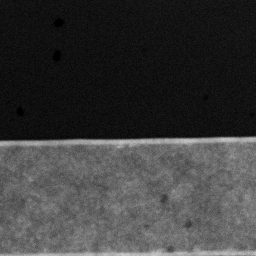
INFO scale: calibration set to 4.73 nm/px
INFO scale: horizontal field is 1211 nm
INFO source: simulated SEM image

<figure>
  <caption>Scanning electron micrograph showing wiring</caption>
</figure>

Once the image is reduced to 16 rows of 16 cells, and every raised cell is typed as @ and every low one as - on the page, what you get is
----------------
----------------
----------------
----------------
----------------
----------------
----------------
----------------
----------------
@@@@@@@@@@@@@@@@
@@@@@@@@@@@@@@@@
@@@@@@@@@@@@@@@@
@@@@@@@@@@@@@@@@
@@@@@@@@@@@@@@@@
@@@@@@@@@@@@@@@@
@@@@@@@@@@@@@@@@